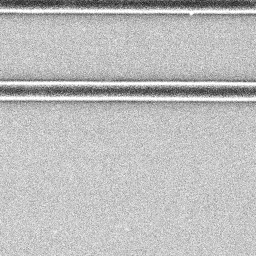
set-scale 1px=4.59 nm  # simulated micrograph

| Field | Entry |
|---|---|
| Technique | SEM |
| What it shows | one or a few lines or trenches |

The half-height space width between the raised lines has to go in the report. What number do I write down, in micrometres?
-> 0.321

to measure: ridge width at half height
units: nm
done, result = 79.1